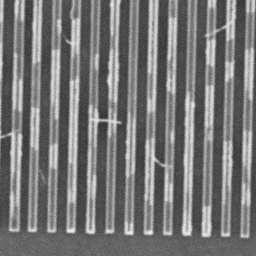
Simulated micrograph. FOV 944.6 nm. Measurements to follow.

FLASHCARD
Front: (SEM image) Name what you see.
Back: parallel lines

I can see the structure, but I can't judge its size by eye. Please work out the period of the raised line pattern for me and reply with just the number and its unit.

71 nanometers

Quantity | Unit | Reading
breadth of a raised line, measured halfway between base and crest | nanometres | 29.1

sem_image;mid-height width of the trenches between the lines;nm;42